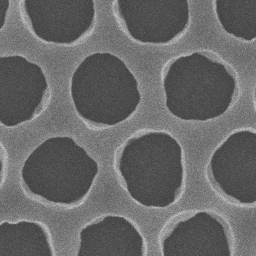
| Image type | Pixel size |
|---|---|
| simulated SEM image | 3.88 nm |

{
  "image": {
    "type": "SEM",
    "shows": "holes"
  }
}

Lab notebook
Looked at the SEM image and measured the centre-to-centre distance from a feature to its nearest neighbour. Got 357 nm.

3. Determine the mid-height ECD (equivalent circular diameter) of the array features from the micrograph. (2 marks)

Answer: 272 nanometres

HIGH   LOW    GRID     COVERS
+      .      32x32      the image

.++.........+++........++++.....
.++.........+++.........+++.....
.++.........+++.........+++.....
++++........++++.......+++++....
+++++.....++++++......+++++++...
++++++++.++++++++++..+++++++++++
+++++++++++++++++++++++++.++++++
...++++++++....+++++++.....+++++
.....+++++......+++++........+++
......+++........++++........+++
......+++........+++..........++
......+++........++++........+++
......+++........++++........+++
.....++++........++++........+++
....++++++......++++++.....+++++
..+++++++++....+++++++++++++++++
++++++++++++++++++++++++++++++.+
++++++...+++++++......++++++....
+++++.....+++++........++++.....
++++.......++++........+++......
+++.........+++........+++......
+++.........+++........+++......
+++.........++++.......+++......
++++.......+++++.......++++.....
+++++......+++++......++++++....
++++++++.+++++++++...+++++++++++
+++++++++++++++++++++++++.++++++
++++++++++++....+++++++.....++++
.....++++++......++++........+++
......++++........++.........+++
......++++........++.........+++
.......+++........++.........+++